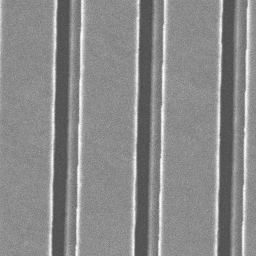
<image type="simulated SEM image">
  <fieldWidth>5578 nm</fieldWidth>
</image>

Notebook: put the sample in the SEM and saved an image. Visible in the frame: lines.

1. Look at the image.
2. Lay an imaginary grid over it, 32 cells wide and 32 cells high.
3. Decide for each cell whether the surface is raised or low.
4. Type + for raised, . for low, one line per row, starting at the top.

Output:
+++++++..++++++++..+++++++++..++
+++++++..++++++++..+++++++++..++
+++++++..++++++++..+++++++++..++
+++++++..++++++++..+++++++++..++
+++++++..++++++++..+++++++++..++
+++++++..++++++++..+++++++++..++
+++++++..++++++++..+++++++++..++
+++++++..++++++++..+++++++++..++
+++++++..++++++++..+++++++++..++
+++++++..++++++++..+++++++++..++
+++++++..++++++++..+++++++++..++
+++++++..++++++++..++++++++...++
+++++++..++++++++..++++++++...++
+++++++..++++++++..++++++++...++
+++++++..++++++++..++++++++..+++
+++++++..++++++++..++++++++..+++
+++++++..++++++++..++++++++..+++
+++++++..++++++++..++++++++..+++
+++++++..++++++++..++++++++..+++
+++++++..++++++++..++++++++..+++
+++++++..++++++++..++++++++..+++
+++++++..++++++++..++++++++..+++
+++++++..++++++++..++++++++..+++
++++++...++++++++..++++++++..+++
++++++...++++++++..++++++++..+++
++++++...++++++++..++++++++..+++
++++++..+++++++++..++++++++..+++
++++++..+++++++++..++++++++..+++
++++++..+++++++++..++++++++..+++
++++++..+++++++++..++++++++..+++
++++++..+++++++++..++++++++..+++
++++++..+++++++++..++++++++..+++